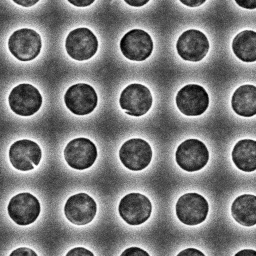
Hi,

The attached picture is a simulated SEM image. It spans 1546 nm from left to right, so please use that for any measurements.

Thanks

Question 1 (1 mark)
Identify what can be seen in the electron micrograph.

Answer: a regular array of holes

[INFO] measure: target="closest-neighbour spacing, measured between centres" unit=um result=0.329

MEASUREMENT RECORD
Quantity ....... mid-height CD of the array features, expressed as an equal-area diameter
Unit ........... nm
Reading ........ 201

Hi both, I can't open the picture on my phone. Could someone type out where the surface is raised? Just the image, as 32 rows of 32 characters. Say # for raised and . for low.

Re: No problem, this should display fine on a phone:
##..#####..#####..#####..#####..
################################
################################
###.######.#####################
#....###....###....###....###...
#....###....###....###....###...
#....###....###....###....###...
##..#####..#####..#####..#####..
################################
################################
##########.#####..##############
#....###....###....###....###...
#....###....###....###....###...
#....###....###....###....###...
###.#############.######.#####..
################################
################################
###.#####..#####..#####..#####..
#....###....###....###....###...
#....###....###....###....###...
#....###....###....###....###...
################################
################################
################################
##..#####..#####..#####..#####..
#....###....###....###....###...
#....###....###....###....###...
##..#####...###...####....###...
################################
################################
################################
#...####...####...#####..#####..